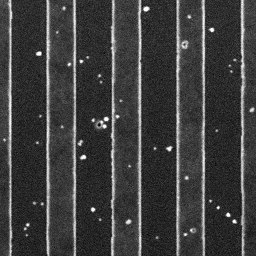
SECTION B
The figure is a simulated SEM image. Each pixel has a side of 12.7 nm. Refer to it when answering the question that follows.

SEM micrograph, lines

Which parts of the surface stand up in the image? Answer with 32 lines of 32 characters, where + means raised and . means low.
+.....+++.....++++....+++.....++
+.....+++.....++++....+++.....++
+.....+++.....+++.....+++.....++
+.....+++.....+++.....+++.....++
+.....+++.....++++....+++.....++
+.....+++.....++++....+++.....++
+.....+++.....++++....+++.....++
+.....+++.....+++.....+++.....++
+.....+++.....+++.....+++.....++
+.....+++.....+++.....+++.....++
+.....+++.....+++.....+++.....++
+.....+++.....+++.....+++.....++
+.....+++.....+++.....+++.....++
+.....+++.....+++.....+++.....++
+.....+++.....++++....+++.....++
+.....+++.....++++....+++.....++
+.....+++.....++++....+++.....++
+.....+++.....+++.....+++.....++
+.....+++.....+++.....+++.....++
+.....+++.....++++....+++.....++
+.....+++.....++++....+++.....++
+.....+++.....+++.....+++.....++
+.....+++.....++++....+++.....++
+.....+++.....++++....+++.....++
+.....+++.....++++....+++.....++
+.....+++.....++++....+++.....++
+.....+++.....++++....+++.....++
+.....+++.....++++....+++.....++
+.....+++.....++++....+++.....++
+.....+++.....++++....+++.....++
+.....+++.....++++....+++.....++
+.....+++.....++++....+++.....++